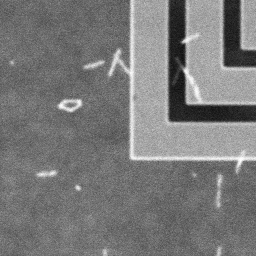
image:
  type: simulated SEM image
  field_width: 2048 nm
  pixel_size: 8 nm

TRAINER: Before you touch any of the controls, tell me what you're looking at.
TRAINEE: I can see groups of lines, slits or small figures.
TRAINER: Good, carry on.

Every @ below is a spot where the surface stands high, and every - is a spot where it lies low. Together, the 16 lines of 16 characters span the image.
--------@@--@@-@
--------@@--@@-@
--------@@--@@-@
--------@@--@@--
--------@@--@@@@
--------@@--@@@@
--------@@------
--------@@@-----
--------@@@@@@@@
--------@@@@@@@@
----------------
----------------
----------------
----------------
----------------
----------------